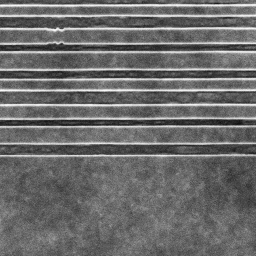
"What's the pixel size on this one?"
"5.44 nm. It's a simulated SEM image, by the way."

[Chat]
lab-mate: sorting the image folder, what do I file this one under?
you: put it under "parallel lines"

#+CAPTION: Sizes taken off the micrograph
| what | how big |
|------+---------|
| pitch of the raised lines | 24.9 px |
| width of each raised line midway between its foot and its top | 78.9 nanometers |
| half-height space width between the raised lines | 10.3 pixels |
